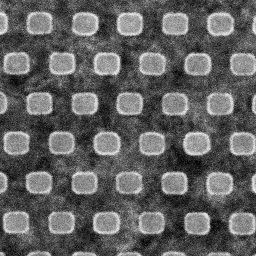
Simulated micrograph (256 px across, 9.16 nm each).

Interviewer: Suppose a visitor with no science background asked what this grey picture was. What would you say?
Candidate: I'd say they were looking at a regular array of raised bodies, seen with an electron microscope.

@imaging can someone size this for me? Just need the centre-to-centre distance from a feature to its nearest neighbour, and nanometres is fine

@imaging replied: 412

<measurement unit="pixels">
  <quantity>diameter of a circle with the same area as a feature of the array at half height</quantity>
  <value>24.3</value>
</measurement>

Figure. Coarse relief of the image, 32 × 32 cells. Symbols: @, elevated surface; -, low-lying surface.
--------------------------------
--------------------------------
@--@@@---@@@---@@@--@@@---@@@---
@--@@@---@@@---@@@--@@@---@@@---
--------------------------------
--------------------------------
--------------------------------
-@@@--@@@---@@@---@@@--@@@---@@@
-@@@--@@@---@@@---@@@--@@@---@@@
--------------------------------
--------------------------------
--------------------------------
@---@@---@@@---@@@--@@@---@@@---
@---@@---@@@---@@@--@@@---@@@---
--------------------------------
--------------------------------
--------------------------------
-@@@--@@@---@@@---@@---@@@---@@@
-@@@--@@@---@@@---@@---@@@---@@@
--------------------------------
--------------------------------
--------------------------------
@--@@@---@@@---@@@--@@@---@@@---
@---@@---@@@---@@@--@@@---@@@---
--------------------------------
--------------------------------
--@-----------------------------
-@@---@@@---@@@--@@@---@@@---@@@
-@@---@@@---@@@---@@---@@@---@@@
--------------------------------
--------------------------------
----@@--------------------------